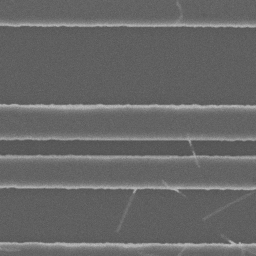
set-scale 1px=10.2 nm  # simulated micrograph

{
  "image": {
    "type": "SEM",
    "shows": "lines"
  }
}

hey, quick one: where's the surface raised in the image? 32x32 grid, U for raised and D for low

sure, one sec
UUUUUUUUUUUUUUUUUUUUUUUUUUUUUUUU
UUUUUUUUUUUUUUUUUUUUUUUUUUUUUUUU
UUUUUUUUUUUUUUUUUUUUUUUUUUUUUUUU
DDDDDDDDDDDDDDDDDDDDDDDDDDDDDDDD
DDDDDDDDDDDDDDDDDDDDDDDDDDDDDDDD
DDDDDDDDDDDDDDDDDDDDDDDDDDDDDDDD
DDDDDDDDDDDDDDDDDDDDDDDDDDDDDDDD
DDDDDDDDDDDDDDDDDDDDDDDDDDDDDDDD
DDDDDDDDDDDDDDDDDDDDDDDDDDDDDDDD
DDDDDDDDDDDDDDDDDDDDDDDDDDDDDDDD
DDDDDDDDDDDDDDDDDDDDDDDDDDDDDDDD
DDDDDDDDDDDDDDDDDDDDDDDDDDDDDDDD
DDDDDDDDDDDDDDDDDDDDDDDDDDDDDDDD
UUUUUUUUUUUUUUUUUUUUUUUUUUUUUUUU
UUUUUUUUUUUUUUUUUUUUUUUUUUUUUUUU
UUUUUUUUUUUUUUUUUUUUUUUUUUUUUUUU
UUUUUUUUUUUUUUUUUUUUUUUUUUUUUUUU
DDDDDDDDDDDDDDDDDDDDDDDUDDDDUUDD
DDDDDDDDDDDDDDDDDDDDDDDDDDDDDDDD
UUUUUUUUUUUDDDDDDDDDDDUUUUDDDDDD
UUUUUUUUUUUUUUUUUUUUUUUUUUUUUUUU
UUUUUUUUUUUUUUUUUUUUUUUUUUUUUUUU
UUUUUUUUUUUUUUUUUUUUUUUUUUUUUUUU
DDDDDDDDDDDDDUUUUUDDUUUUUUUUUUUU
DDDDDDDDDDDDDDDDDDDDDDDDDDDDDDDD
DDDDDDDDDDDDDDDDDDDDDDDDDDDDDDDD
DDDDDDDDDDDDDDDDDDDDDDDDDDDDDDDD
DDDDDDDDDDDDDDDDDDDDDDDDDDDDDDDD
DDDDDDDDDDDDDDDDDDDDDDDDDDDDDDDD
DDDDDDDDDDDDDDDDDDDDDDDDDDDDDDDD
UUUUUUUUUDUDDUDDDDUUDDDDDDDDDUUD
UUUUUUUUUUUUUUUUUUUUUUUUUUUUUUUU